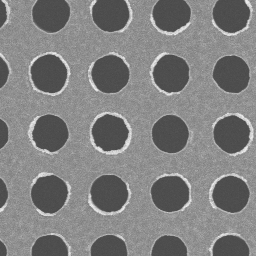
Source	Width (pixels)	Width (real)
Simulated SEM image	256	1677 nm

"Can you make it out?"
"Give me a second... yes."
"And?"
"a regular array of holes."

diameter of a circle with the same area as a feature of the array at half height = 243 nanometres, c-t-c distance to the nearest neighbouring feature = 0.391 µm